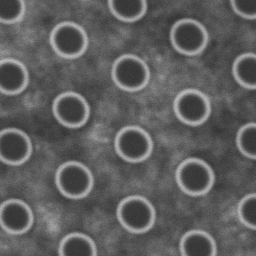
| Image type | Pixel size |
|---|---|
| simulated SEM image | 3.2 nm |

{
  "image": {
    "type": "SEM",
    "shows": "a regular array of raised bodies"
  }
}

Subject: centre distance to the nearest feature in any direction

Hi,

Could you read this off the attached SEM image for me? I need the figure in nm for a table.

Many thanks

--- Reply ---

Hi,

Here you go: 222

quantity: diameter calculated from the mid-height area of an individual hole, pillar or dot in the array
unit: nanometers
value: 112